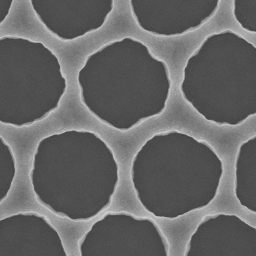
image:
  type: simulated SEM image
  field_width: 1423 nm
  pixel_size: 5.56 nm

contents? holes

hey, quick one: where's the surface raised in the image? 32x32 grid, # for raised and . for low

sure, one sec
.###..........##...........##...
.###..........###..........##...
#####........####.........####..
######......######......#######.
#######...################....##
.....#########....#######......#
......######.......######.......
.......####.........####........
.......###...........##.........
........##...........##.........
........##...........##.........
........##...........##.........
.......###...........##.........
.......####.........####........
......######.......######......#
#..###########...############.##
########...#####################
#####........######.....#######.
.####.........####........####..
..##..........###..........###..
..##...........##...........##..
..##...........##...........##..
..##...........##..........###..
.###..........###..........##...
.####.........###..........###..
#####.........####........####..
#######.....#######....#########
......#######......#######....##
.......####.........#####.......
.......####.........####........
........##...........###........
........##...........##.........